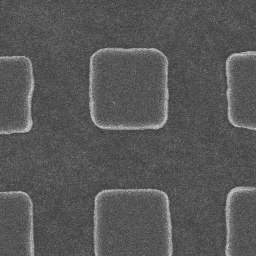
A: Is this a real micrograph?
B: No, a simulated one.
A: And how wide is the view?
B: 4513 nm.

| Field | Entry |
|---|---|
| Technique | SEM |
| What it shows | raised bodies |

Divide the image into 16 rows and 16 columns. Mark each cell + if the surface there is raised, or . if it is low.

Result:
................
................
................
......++++.....+
++....++++....++
++....++++....++
++....++++....++
++....++++....++
................
................
................
................
++....++++....++
++....+++++...++
++....+++++...++
++....+++++...++